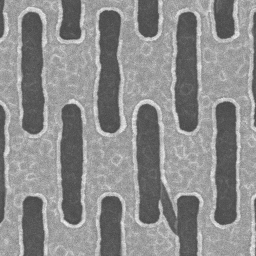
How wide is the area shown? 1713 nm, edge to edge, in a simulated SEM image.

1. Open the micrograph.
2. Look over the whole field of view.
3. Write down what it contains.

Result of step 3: holes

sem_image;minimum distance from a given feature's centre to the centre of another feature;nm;521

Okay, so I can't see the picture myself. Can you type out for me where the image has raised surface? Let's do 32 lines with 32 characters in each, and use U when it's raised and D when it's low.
DUUUUUUUDDUUUUUUUDDDUUUUUUUDDUUU
UUUUUUUUDDUUUDDUUDDDUUUDUUUDDUUU
DUUDDUUUDDUUDDDUUDDDUUDDDUUDDUUU
DUUDDUUUDDUUDDDUUDDDUUDDDUUDDUUD
UUUDDUUUDDUUDDDUUUDUUUDDDUUDDUUU
UUUDDUUUUUUUDDDUUUUUUUDDDUUUUUUU
UUUDDUUUUUUUDDDUUUUUUUDDDUUUUUUU
UUUDDUUUUUUUDDDUUUUUUUDDDUUUUUUU
UUUDDUUUUUUUUDDUUUUUUUDDDUUUUUUU
UUUDDUUUUUUUDDDUUUUUUUDDDUUUUUUU
UUUDDUUUUUUUDDDUUUUUUUDDDUUUUUUD
UUUDDUUUUUUUDDDUUUUUUUDDDUUUUUUU
UUUDDDUUUUUUDDDUUUUUUUDDDUUUUUUU
UUUDDDUUDDUUDDDUUDDUUUDDDUUDDUUU
DUUDDUUUDDUUDDDUUDDDUUDDDUUDDDUU
DUUDDUUUDDUUDDDUUDDDUUDDDUUDDDUU
DUUDDUUUDDUUUDUUUDDDUUUUUUUDDDUU
DUUUUUUUDDUUUUUUUDDDUUUUUUUDDDUU
DUUUUUUDDDUUUUUUUDDDUUUUUUUDDDUU
DUUUUUUDDDUUUUUUUDDDUUUUUUUDDDUU
DUUUUUUUDDUUUUUUUDDDUUUUUUUDDDUU
DUUUUUUUDDUUUUUUUDDDUUUUUUUDDDUU
DUUUUUUUDDUUUUUUUDDDUUUUUUUDDDUU
DUUUUUUUDDUUUUUUUDDDDUUUUUUDDDUU
DUUUUUUUDDUUUUUUUDDDDUUDUUUDDDUU
DUUDDUUUDDUUUDDUUDDDDUDDDUUDDDUU
DUUDDUUUDDUUUDDUUDDDDDDDDUUDDDUU
UUUDDUUUDDUUDDDUUUDDUDDDDUUDDUUU
UUUDDDUUUUUUDDDUUUUUUDDDDUUUUUUU
UUUDDDUUUUUUUDDUUUUUUUDDDUUUUUUU
UUUDDDUUUUUUDDDUUUUUUUDDDUUUUUUU
UUUDDDUUUUUUUDDUUUUUUUDDDUUUUUUU